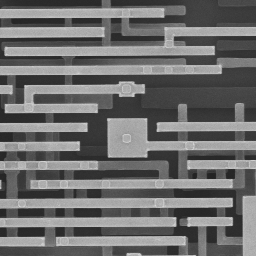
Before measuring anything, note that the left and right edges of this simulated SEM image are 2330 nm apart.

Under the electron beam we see wiring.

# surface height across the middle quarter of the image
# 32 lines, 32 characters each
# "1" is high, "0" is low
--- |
11111111111111111111111111111111
11111111111111111111111111111111
11111111111111111111111111111111
11000000000000000000000000000000
11000000000000000000000000000000
11111111111111111111000000000000
11111111111111111111000000000000
11000000000001111100000000000000
11000000000000000000000000000000
11000000000000000000000000000000
11111111000000000000000000000110
11111111000000000000000000000110
00000000000000000000000000000110
00000000000000000000000000000110
00000000000111111111100000001110
11111100000111111111100111111111
11111100000111111111100111111111
00000000000111111111100000000110
00000000000111111111100000000110
11110000000111111111111111111111
11110000000111111111111111111111
11110000000111111111111111111111
00000000000111111111100000000110
00000000000000000000000000000110
11111111111111111111111111000111
11111111111111111111111111000111
11100000000000000000000111000110
11000000000000000000000011000110
11000000000000000000000011001110
11111111111111111111111111111111
11111111111111111111111111111111
11000000000000000000000000000000